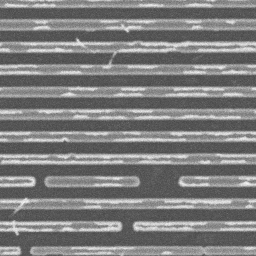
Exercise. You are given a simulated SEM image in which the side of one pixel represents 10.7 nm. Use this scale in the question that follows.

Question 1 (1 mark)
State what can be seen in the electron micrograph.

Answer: parallel lines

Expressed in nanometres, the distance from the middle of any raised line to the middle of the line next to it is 240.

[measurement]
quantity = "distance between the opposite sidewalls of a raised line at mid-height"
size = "108 nm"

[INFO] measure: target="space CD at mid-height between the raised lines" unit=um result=0.137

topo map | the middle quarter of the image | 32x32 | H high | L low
HHHHHHHHHHHHHHHHHHHHHHHHHHHHHHHH
HHHHHHHHHHHHHHHHHHHHHHHHHHHHHHHH
LLLLLLLLLLLLLLLLLLLLLLLLLLLLLLLL
LLLLLLLLLLLLLLLLLLLLLLLLLLLLLLLL
LLLLLLLLLLLLLLLLLLLLLLLLLLLLLLLL
LLLLLLLLLLLLLLLLLLLLLLLLLLLLLLLL
HHHHHHHHHHHHHHHHHHHHHHHHHHHHHHHH
HHHHHHHHHHHHHHHHHHHHHHHHHHHHHHHH
LLLLLLLLLLLLLLLLLLLLLLLLLLLLLLLL
LLLLLLLLLLLLLLLLLLLLLLLLLLLLLLLL
LLLLLLLLLLLLLLLLLLLLLLLLLLLLLLLL
LLLLLLLLLLLLLLLLLLLLLLLLLLLLLLLL
HHHHHHHHHHHHHHHHHHHHHHHHHHHHHHHH
HHHHHHHHHHHHHHHHHHHHHHHHHHHHHHHH
LLLLLLLLLLLLLLLLLLLLLLLLLLLLLLLL
LLLLLLLLLLLLLLLLLLLLLLLLLLLLLLLL
LLLLLLLLLLLLLLLLLLLLLLLLLLLLLLLL
HHHHHHHHHHHHHHHHHHHHHHHHHHHHHHHH
HHHHHHHHHHHHHHHHHHHHHHHHHHHHHHHH
LLLLLLLLLLLLLLLLLLLLLLLLLLLLLLLL
LLLLLLLLLLLLLLLLLLLLLLLLLLLLLLLL
LLLLLLLLLLLLLLLLLLLLLLLLLLLLLLLL
LHHLLLLLLLLLLLLLLLLLLLLLLLLLLLLL
HHHHHHHHHHHHHHHHHHHHHHHHHHHHHHHH
HHHHHHHHHHHHHHHHHHHHHHHHHHHHHHHH
LLLLLLLLLLLLLLLLLLLLLLLLLLLLLLLL
LLLLLLLLLLLLLLLLLLLLLLLLLLLLLLLL
LLLLLLLLLLLLLLLLLLLLLLLLLLLLLLLL
HHHHHHHHHHHHHHHHHHLLLLLLLLLLLHHH
HHHHHHHHHHHHHHHHHHHLLLLLLLLLLHHH
LLLLLLLLLLLLLLLLLLLLLLLLLLLLLLLL
LLLLLLLLLLLLLLLLLLLLLLLLLLLLLLLL